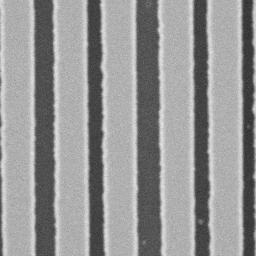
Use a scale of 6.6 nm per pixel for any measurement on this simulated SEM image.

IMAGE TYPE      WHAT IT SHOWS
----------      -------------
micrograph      lines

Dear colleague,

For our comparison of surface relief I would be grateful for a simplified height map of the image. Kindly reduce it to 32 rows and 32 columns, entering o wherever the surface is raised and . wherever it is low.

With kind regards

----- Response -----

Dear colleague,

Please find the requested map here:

oooo...oooo..oooo...oooo..oooo..
oooo...oooo..oooo...oooo..oooo..
oooo...oooo..oooo...oooo..oooo..
oooo...oooo..oooo...oooo..oooo..
oooo...oooo..oooo...oooo..oooo..
oooo...oooo..oooo...oooo..oooo..
oooo...oooo..oooo...oooo..oooo..
oooo...oooo..oooo...oooo..oooo..
oooo...oooo..oooo...oooo..oooo..
oooo...oooo..oooo...oooo..oooo..
oooo...oooo..oooo...oooo..oooo..
oooo...oooo..oooo...oooo..oooo..
oooo...oooo..oooo...oooo..oooo..
oooo...oooo..oooo...oooo..oooo..
oooo...oooo..oooo...oooo..oooo..
oooo...oooo..oooo...oooo..oooo..
oooo...oooo..oooo...oooo..oooo..
oooo...oooo..oooo...oooo..oooo..
oooo...oooo..oooo...oooo..oooo..
oooo...oooo..oooo...oooo..oooo..
oooo...oooo..oooo...oooo..oooo..
oooo...oooo..oooo...oooo..oooo..
oooo...oooo..oooo...oooo..oooo..
oooo...oooo..oooo...oooo..oooo..
oooo...oooo..oooo...oooo..oooo..
oooo...oooo..oooo...oooo..oooo..
oooo...oooo..oooo...oooo..oooo..
oooo...oooo..oooo...oooo..oooo..
oooo...oooo..oooo...oooo..oooo..
oooo...oooo..oooo...oooo..oooo..
oooo...oooo..oooo...oooo..oooo..
oooo...oooo..oooo...oooo..oooo..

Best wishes